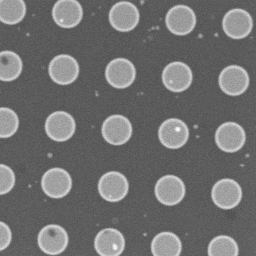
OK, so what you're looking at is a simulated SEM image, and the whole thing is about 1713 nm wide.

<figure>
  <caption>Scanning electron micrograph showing an array of small figures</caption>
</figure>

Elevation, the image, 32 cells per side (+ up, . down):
+++....+++....++................
+++....+++....+++....+++.....++.
+++....+++....+++....+++....+++.
..............+++....+++....+++.
.............................++.
................................
+...............................
+++...+++.....++................
+++...++++...++++....+++....++..
++....++++...++++...++++...++++.
.......++.....++....++++...++++.
............................++..
................................
+...............................
++....+++.....+.................
++....+++....+++....+++.....++..
++....+++....+++....++++...++++.
.......+.....+++....+++....++++.
.....................+.....+++..
................................
................................
++....++......+.................
++...++++...++++....+++.....+...
+....++++...++++...++++....+++..
......++.....+++...++++...++++..
....................++.....+++..
................................
................................
+.....++........................
+....+++....+++.....++..........
+....+++....++++...++++...++++..
......++....+++....++++...++++..